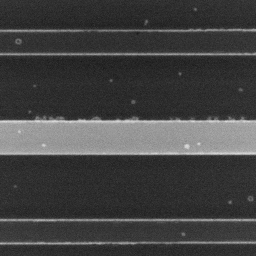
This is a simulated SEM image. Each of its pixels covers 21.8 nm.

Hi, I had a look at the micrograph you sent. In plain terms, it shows lines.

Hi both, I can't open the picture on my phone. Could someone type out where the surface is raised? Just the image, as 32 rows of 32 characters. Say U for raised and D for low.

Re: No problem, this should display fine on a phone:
DDDDDDDDDDDDDDDDDDDDDDDDDDDDDDDD
DDDDDDDDDDDDDDDDDDDDDDDDDDDDDDDD
DDDDDDDDDDDDDDDDDDDDDDDDDDDDDDDD
DDDDDDDDDDDDDDDDDDDDDDDDDDDDDDDD
UUUUUUUUUUUUUUUUUUUUUUUUUUUUUUUU
UUUUUUUUUUUUUUUUUUUUUUUUUUUUUUUU
UUUUUUUUUUUUUUUUUUUUUUUUUUUUUUUU
DDDDDDDDDDDDDDDDDDDDDDDDDDDDDDDD
DDDDDDDDDDDDDDDDDDDDDDDDDDDDDDDD
DDDDDDDDDDDDDDDDDDDDDDDDDDDDDDDD
DDDDDDDDDDDDDDDDDDDDDDDDDDDDDDDD
DDDDDDDDDDDDDDDDDDDDDDDDDDDDDDDD
DDDDDDDDDDDDDDDDDDDDDDDDDDDDDDDD
DDDDDDDDDDDDDDDDDDDDDDDDDDDDDDDD
DDDDDDDDDDDDDDDDDDDDDDDDDDDDDDDD
UUUUUUUUUUUUUUUUUUUUUUUUUUUUUUUU
UUUUUUUUUUUUUUUUUUUUUUUUUUUUUUUU
UUUUUUUUUUUUUUUUUUUUUUUUUUUUUUUU
UUUUUUUUUUUUUUUUUUUUUUUUUUUUUUUU
DDDDDDDDDDDDDDDDDDDDDDDDDDDDDDDD
DDDDDDDDDDDDDDDDDDDDDDDDDDDDDDDD
DDDDDDDDDDDDDDDDDDDDDDDDDDDDDDDD
DDDDDDDDDDDDDDDDDDDDDDDDDDDDDDDD
DDDDDDDDDDDDDDDDDDDDDDDDDDDDDDDD
DDDDDDDDDDDDDDDDDDDDDDDDDDDDDDDD
DDDDDDDDDDDDDDDDDDDDDDDDDDDDDDDD
DDDDDDDDDDDDDDDDDDDDDDDDDDDDDDDD
DDDDDDDDDDDDDDDDDDDDDDDDDDDDDDDD
UUUUUUUUUUUUUUUUUUUUUUUUUUUUUUUU
UUUUUUUUUUUUUUUUUUUUUUUUUUUUUUUU
DDDDDDDDDDDDDDDDDDDDDDDDDDDDDDDD
DDDDDDDDDDDDDDDDDDDDDDDDDDDDDDDD